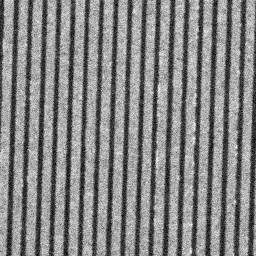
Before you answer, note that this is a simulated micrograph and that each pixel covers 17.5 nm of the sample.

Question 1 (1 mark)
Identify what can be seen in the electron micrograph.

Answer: parallel lines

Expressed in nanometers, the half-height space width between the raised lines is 98.6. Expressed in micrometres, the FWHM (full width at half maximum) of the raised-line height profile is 0.153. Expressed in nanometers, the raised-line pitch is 249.